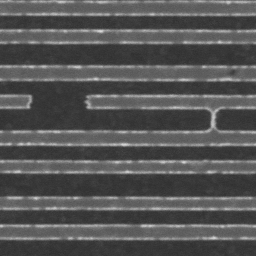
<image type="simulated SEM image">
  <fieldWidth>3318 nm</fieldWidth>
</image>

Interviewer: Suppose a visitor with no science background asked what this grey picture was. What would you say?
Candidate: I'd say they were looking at parallel lines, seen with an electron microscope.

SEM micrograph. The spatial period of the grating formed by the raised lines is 416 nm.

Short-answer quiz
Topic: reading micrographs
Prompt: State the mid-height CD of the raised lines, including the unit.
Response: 176 nm